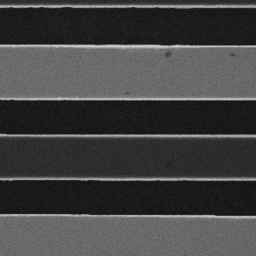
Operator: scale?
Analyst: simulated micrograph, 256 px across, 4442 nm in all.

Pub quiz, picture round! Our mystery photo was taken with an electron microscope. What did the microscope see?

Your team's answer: lines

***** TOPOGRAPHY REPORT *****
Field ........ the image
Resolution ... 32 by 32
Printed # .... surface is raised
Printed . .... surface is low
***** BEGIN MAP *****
################################
................................
................................
................................
................................
................................
################################
################################
################################
################################
################################
################################
................................
................................
................................
................................
................................
################################
################################
################################
################################
################################
..............##..#.##...######.
................................
................................
................................
................................
################################
################################
################################
################################
################################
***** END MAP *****